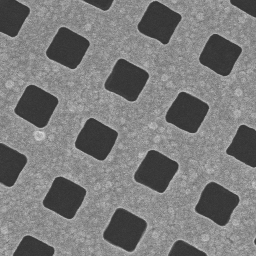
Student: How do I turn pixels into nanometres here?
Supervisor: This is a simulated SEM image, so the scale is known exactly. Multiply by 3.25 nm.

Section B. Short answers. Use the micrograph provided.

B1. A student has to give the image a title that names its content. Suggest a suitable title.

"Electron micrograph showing a regular array of holes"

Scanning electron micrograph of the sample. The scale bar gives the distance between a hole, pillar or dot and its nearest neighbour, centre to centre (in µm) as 0.215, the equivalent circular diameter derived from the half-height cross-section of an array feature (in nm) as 126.